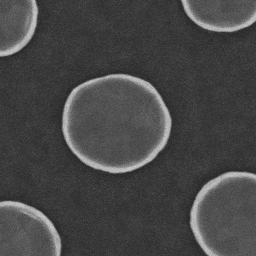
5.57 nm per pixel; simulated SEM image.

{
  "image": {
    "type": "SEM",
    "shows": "raised bodies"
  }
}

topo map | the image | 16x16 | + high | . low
++..........++++
++...........++.
++..............
................
................
.....++++.......
....++++++......
....++++++......
....++++++......
.....+++++......
......++........
.............+++
............++++
+++.........++++
+++.........++++
++++.........+++